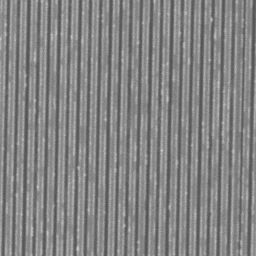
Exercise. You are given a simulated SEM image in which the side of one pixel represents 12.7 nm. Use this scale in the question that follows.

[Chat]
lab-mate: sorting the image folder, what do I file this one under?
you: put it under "parallel lines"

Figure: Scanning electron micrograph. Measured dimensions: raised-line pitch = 0.13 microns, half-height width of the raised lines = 6.25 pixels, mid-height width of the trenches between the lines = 57.1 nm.